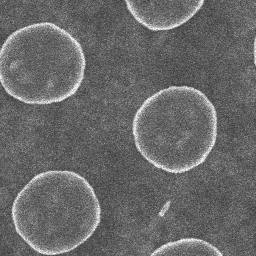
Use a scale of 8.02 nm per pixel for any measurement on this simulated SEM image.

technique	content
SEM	raised bodies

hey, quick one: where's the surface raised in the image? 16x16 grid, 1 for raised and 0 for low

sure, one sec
0000000011110000
0000000001100000
0111100000000000
1111100000000000
1111100000000000
1111100000010000
0000000001111000
0000000011111000
0000000011111000
0000000001111000
0000000000110000
0011100000000000
0111110000000000
0111110000000000
0111110000000000
0011100000111000